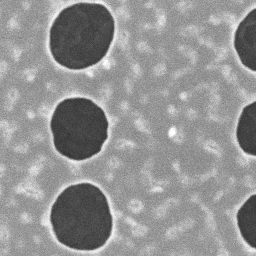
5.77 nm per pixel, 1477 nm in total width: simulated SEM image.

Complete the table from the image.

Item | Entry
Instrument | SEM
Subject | holes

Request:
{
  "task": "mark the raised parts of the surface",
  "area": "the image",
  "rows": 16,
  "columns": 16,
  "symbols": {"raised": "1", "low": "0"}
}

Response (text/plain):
1111000111111111
1110000111111110
1110000111111110
1110000111111110
1111111111111111
1111111111111111
1111001111111111
1110000111111110
1110000111111110
1111001111111110
1111111111111111
1111101111111111
1110000111111110
1110000111111110
1110000111111110
1111001111111111